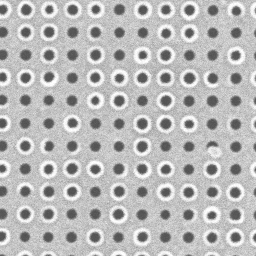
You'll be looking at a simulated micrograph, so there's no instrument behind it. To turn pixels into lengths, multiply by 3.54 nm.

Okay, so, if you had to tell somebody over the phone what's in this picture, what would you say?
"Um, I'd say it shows a regular array of holes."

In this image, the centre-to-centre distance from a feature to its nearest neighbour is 79.8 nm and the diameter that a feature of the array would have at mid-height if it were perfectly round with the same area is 38.6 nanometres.